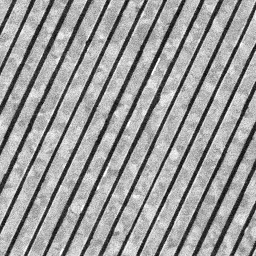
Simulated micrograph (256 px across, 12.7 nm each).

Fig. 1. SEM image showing parallel lines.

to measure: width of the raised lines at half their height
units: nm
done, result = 151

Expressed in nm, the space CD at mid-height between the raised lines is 63.3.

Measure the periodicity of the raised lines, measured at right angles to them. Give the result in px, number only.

17